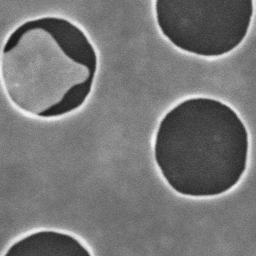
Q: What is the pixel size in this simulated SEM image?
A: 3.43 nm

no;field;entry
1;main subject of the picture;holes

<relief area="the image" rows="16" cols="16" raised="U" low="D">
UUUUUUUUUUDDDDDD
UDDDDUUUUUDDDDDD
DDDDDUUUUUUDDDDU
DUUDDDUUUUUUUUUU
UUUDDDUUUUUUUUUU
UUDDDDUUUUUUUUUU
UDDDDUUUUUUDDDUU
UUUUUUUUUUDDDDDU
UUUUUUUUUUDDDDDU
UUUUUUUUUUDDDDDU
UUUUUUUUUUDDDDDU
UUUUUUUUUUUDDDDU
UUUUUUUUUUUUUUUU
UUUUUUUUUUUUUUUU
UUUUUUUUUUUUUUUU
UDDDDUUUUUUUUUUU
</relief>